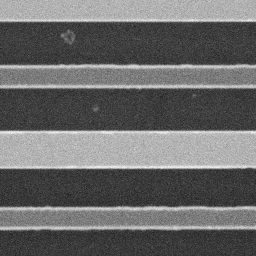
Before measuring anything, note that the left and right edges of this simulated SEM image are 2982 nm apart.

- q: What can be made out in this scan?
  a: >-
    lines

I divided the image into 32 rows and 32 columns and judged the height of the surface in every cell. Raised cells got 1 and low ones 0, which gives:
11111111111111111111111111111111
11111111111111111111111111111111
11111111111111111111111111111111
00000000000000000000000000000000
00000000000000000000000000000000
00000000000000000000000000000000
00000000000000000000000000000000
00000000000000000000000000000000
11111111111111111111111111111111
11111111111111111111111111111111
11111111111111111111111111111111
00000000000000000000000000000000
00000000000000000000000000000000
00000000000000000000000000000000
00000000000000000000000000000000
00000000000000000000000000000000
11111111111111111111111111111111
11111111111111111111111111111111
11111111111111111111111111111111
11111111111111111111111111111111
11111111111111111111111111111111
00000000000000000000000000000000
00000000000000000000000000000000
00000000000000000000000000000000
00000000000000000000000000000000
00000000000000000000000000000000
11111111111111111111111111111111
11111111111111111111111111111111
11111111111111111111111111111111
00000000000000000000000000000000
00000000000000000000000000000000
00000000000000000000000000000000